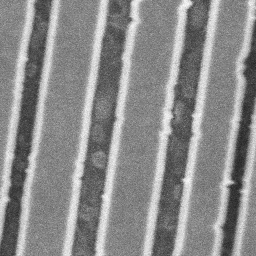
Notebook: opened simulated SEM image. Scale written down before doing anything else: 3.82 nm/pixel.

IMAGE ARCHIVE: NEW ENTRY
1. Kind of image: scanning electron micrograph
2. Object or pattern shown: one or a few lines or trenches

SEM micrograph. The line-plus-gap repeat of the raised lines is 292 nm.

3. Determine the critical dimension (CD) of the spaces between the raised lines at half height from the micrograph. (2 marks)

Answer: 0.108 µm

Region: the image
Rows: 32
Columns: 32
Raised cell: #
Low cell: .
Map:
####...######....#######...#####
####...######....######....#####
####...######....######...######
####..#######...#######...#####.
###...######....#######...#####.
###...######....######....#####.
###...######....######....#####.
###...######....######....####..
###...######....######...#####..
###...######...#######...#####..
###..#######...#######...#####..
##...######....######....#####..
##...######....######....#####..
##...######....######....#####..
##...######....######....#####..
##...######....######...######..
##...######...#######...#####...
##..#######...#######...#####..#
#...######....######....#####..#
#...######....######....#####..#
#...######....######....#####..#
#...######....######....#####..#
#..#######....######...######..#
#..#######...#######...#####...#
#..#######...#######...#####..##
#..######....######....#####..##
...######....######....#####..##
...######....######....#####..##
...######....######....####...##
...######....######...#####...##
..#######...#######...#####...##
..#######...#######...#####..###